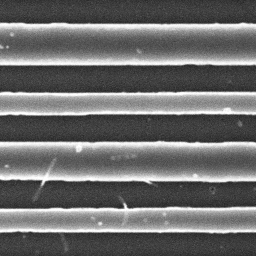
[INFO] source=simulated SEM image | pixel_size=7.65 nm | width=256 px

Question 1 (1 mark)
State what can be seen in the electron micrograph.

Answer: lines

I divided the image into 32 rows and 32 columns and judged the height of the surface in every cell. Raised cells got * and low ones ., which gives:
................................
................................
................................
********************************
********************************
********************************
********************************
********************************
................................
................................
................................
................................
********************************
********************************
................................
................................
................................
................................
********************************
********************************
********************************
********************************
.....*............*......*****.*
................................
................................
................................
********************************
********************************
********************************
................................
................................
................................